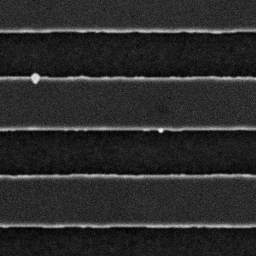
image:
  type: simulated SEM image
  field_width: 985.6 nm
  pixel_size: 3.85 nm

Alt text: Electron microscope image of lines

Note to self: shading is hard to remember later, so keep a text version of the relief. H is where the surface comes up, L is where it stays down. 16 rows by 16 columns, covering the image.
HHHHHHHHHHHHHHHH
HHHHHHHHHHHHHHHH
LLLLLLLLLLLLLLLL
LLLLLLLLLLLLLLLL
LLLLLLLLLLLLLLLL
HHHHHHHHHHHHHHHH
HHHHHHHHHHHHHHHH
HHHHHHHHHHHHHHHH
LLLLLLLLLLLLLLLL
LLLLLLLLLLLLLLLL
LLLLLLLLLLLLLLLL
HHHHHHHHHHHHHHHH
HHHHHHHHHHHHHHHH
HHHHHHHHHHHHHHHH
LLLLLLLLLLLLLLLL
LLLLLLLLLLLLLLLL